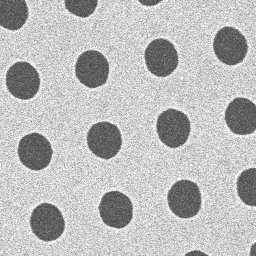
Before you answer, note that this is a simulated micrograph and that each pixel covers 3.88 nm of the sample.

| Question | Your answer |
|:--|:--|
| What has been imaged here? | a regular array of holes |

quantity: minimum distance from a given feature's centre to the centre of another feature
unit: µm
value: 0.27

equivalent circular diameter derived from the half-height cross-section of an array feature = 139 nanometres